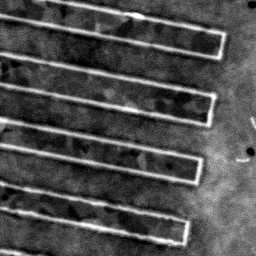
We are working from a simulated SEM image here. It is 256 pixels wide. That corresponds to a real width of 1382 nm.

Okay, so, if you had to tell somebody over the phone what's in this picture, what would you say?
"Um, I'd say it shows one or a few lines or trenches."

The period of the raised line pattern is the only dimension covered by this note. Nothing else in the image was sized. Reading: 339 nm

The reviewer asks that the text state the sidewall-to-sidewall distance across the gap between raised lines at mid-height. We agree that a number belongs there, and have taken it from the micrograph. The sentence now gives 0.2 um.